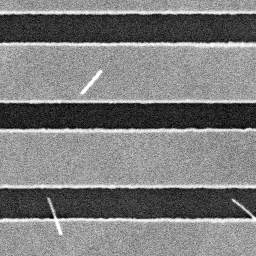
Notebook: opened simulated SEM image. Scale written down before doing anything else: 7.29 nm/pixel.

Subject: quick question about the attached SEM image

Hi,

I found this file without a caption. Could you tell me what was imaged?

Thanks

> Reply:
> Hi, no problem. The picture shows lines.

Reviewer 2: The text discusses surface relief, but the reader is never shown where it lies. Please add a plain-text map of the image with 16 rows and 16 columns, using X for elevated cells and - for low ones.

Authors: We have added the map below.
XXXXXXXXXXXXXXXX
----------------
----------------
XXXXXXXXXXXXXXXX
XXXXXXXXXXXXXXXX
XXXXXXXXXXXXXXXX
----------------
----------------
XXXXXXXXXXXXXXXX
XXXXXXXXXXXXXXXX
XXXXXXXXXXXXXXXX
XXXXXXXXXXXXXXXX
----------------
----------------
XXXXXXXXXXXXXXXX
XXXXXXXXXXXXXXXX